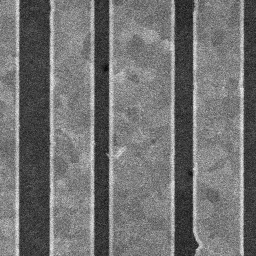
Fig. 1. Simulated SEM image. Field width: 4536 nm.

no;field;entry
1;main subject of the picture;one or a few lines or trenches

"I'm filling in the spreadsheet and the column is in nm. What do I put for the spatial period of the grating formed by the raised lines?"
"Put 1300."